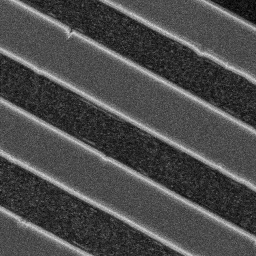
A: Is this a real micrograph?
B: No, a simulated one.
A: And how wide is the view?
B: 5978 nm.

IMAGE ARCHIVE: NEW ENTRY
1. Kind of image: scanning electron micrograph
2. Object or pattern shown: one or a few lines or trenches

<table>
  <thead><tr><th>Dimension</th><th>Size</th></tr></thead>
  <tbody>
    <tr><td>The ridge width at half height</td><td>1160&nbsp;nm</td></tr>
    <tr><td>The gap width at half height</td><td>1010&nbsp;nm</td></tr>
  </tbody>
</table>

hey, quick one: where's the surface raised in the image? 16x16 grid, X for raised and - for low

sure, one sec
XX-----XXXXXXX--
XXXX-----XXXXXXX
XXXXXX-----XXXXX
-XXXXXX------XXX
--XXXXXXX------X
----XXXXXXX-----
X-----XXXXXXX---
XX------XXXXXXX-
XXXX------XXXXXX
XXXXXX------XXXX
--XXXXXX------XX
----XXXXXX-----X
-----XXXXXXX----
X------XXXXXX---
XXX------XXXXXX-
XXXXX------XXXXX